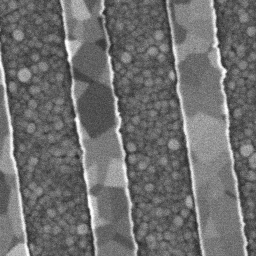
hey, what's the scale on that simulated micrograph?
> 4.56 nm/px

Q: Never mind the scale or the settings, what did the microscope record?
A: one or a few lines or trenches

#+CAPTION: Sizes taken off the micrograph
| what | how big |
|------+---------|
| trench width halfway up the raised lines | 302 nanometres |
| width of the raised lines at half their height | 188 nm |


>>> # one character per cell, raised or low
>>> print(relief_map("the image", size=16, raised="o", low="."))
....oo....ooo...
....ooo....oo...
....ooo....ooo..
....ooo....ooo..
....ooo....ooo..
.....oo....ooo..
.....oo....ooo..
o....oo....ooo..
o....oo.....oo..
o....ooo....oo..
o....ooo....ooo.
o....ooo....ooo.
o.....oo....ooo.
o.....oo....ooo.
oo....oo....ooo.
oo....ooo....oo.